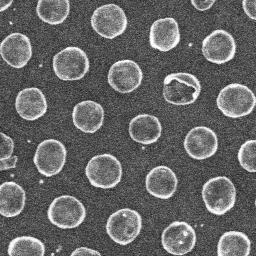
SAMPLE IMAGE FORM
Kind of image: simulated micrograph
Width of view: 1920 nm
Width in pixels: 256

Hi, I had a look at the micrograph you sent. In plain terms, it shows a regular array of raised bodies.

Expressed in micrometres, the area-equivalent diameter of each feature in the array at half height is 0.248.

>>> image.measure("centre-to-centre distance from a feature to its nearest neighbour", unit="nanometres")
415